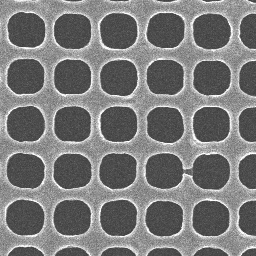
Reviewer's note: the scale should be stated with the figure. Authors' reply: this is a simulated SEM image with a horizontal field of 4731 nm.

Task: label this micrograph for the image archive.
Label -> a regular array of holes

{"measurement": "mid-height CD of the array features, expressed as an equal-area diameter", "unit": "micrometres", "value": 0.701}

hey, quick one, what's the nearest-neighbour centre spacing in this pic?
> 854 nanometres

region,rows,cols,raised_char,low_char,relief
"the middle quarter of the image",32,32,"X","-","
------XXXX--------XXX--------XXX
-------XX---------XXX---------XX
-------XX---------XXX---------XX
-------XX---------XXX---------XX
-------XX---------XXX---------XX
-------XX---------XXX---------XX
------XXXX--------XXXX-------XXX
----XXXXXXX------XXXXXX-----XXXX
XXXXXXXXXXXXXXXXXXXXXXXXXXXXXXXX
XXXXXXXXXXXXXXXXXXXXXXXXXXXXXXXX
XXXXXXXXXXXXXXXXXXXXXXXXXXXXXXXX
-----XXXXX-------XXXXX-------XXX
------XXX---------XXX--------XXX
-------XX---------XXX---------XX
-------XX---------XXX---------XX
-------XX---------XXX---------XX
-------XX---------XXX---------XX
------XXXX--------XXX---------XX
------XXXX-------XXXXX-------XXX
XX--XXXXXXXX---XXXXXXXXX----XXXX
XXXXXXXXXXXXXXXXXXXXXXXXXXXXXXXX
XXXXXXXXXXXXXXXXXXXXXXXXXXXXXXXX
----XXXXXXX-----XXXXXXXX---XXXXX
------XXXX--------XXX--------XXX
------XXX---------XXX--------XXX
-------XX---------XX----------XX
-------XX---------XX------------
-------XX---------XX----------X-
-------XX---------XX----------XX
------XXX--------XXXX--------XXX
-----XXXXX------XXXXXX------XXXX
XXXXXXXXXXXXXXXXXXXXXXXXXXXXXXXX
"